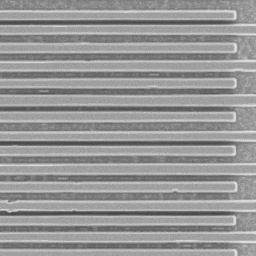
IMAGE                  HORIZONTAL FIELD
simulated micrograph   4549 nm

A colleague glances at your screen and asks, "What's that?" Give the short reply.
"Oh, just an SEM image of parallel lines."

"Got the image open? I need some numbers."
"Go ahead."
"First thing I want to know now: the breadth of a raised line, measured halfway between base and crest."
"169 nm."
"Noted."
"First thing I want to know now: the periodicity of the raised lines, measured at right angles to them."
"303 nm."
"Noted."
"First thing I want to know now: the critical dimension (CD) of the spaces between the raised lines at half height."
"138 nm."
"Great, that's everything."